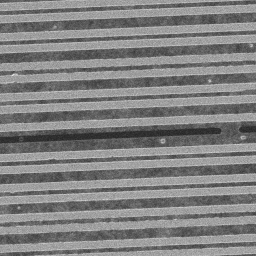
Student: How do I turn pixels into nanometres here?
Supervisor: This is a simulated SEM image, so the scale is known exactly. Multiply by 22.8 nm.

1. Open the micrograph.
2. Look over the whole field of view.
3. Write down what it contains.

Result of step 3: parallel lines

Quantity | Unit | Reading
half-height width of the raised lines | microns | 0.168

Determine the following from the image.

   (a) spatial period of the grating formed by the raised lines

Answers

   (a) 0.347 micrometres